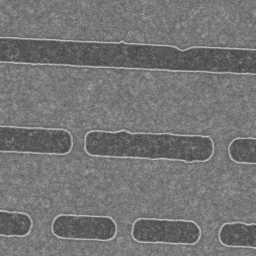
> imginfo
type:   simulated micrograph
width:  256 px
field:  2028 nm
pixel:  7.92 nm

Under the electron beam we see one or a few lines or trenches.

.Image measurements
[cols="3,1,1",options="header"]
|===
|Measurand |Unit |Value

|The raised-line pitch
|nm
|687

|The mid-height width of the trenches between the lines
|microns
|0.503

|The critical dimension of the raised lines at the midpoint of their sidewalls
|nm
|199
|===